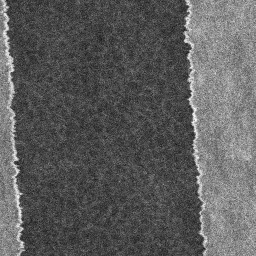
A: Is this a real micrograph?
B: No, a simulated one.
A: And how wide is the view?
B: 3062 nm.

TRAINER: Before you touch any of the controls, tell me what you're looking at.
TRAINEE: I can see one or a few lines or trenches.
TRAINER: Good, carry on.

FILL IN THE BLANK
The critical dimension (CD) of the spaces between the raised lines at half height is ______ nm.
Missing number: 2170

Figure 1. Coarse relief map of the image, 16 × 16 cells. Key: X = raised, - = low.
------------XXXX
------------XXXX
------------XXXX
X-----------XXXX
X-----------XXXX
X-----------XXXX
X-----------XXXX
X-----------XXXX
X-----------XXXX
X-----------XXXX
X-----------XXXX
X-----------XXXX
X------------XXX
X------------XXX
X------------XXX
X------------XXX